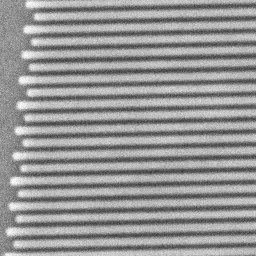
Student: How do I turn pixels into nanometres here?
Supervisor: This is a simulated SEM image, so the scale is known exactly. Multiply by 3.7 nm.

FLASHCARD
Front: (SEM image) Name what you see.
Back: parallel lines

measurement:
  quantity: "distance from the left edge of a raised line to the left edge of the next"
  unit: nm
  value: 46.6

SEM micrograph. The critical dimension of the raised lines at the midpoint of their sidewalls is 23.1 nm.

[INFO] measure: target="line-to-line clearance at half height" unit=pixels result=6.14